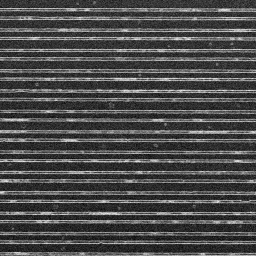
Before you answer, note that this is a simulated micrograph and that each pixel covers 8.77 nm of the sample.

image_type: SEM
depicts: parallel lines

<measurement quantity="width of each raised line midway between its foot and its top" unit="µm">0.0252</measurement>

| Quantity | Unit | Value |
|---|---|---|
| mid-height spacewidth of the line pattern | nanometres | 69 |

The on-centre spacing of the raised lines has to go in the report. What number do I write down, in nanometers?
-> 89.1